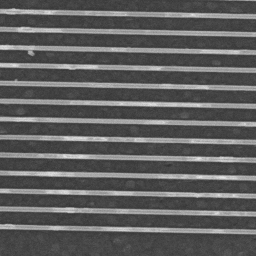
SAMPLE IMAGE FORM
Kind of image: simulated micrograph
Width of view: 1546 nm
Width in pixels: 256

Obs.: parallel lines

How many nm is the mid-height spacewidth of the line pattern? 84.5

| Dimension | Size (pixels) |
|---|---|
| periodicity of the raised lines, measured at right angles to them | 17.9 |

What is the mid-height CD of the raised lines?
22.6 nm